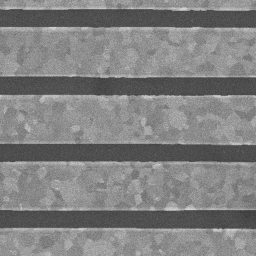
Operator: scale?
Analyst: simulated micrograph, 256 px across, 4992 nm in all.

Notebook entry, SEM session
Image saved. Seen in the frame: lines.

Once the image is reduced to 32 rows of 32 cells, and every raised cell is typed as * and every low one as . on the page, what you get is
********************************
................................
................................
................................
********************************
********************************
********************************
********************************
********************************
............********************
................................
................................
********************************
********************************
********************************
********************************
********************************
********************************
................................
................................
********************************
********************************
********************************
********************************
********************************
********************************
................................
................................
................................
********************************
********************************
********************************